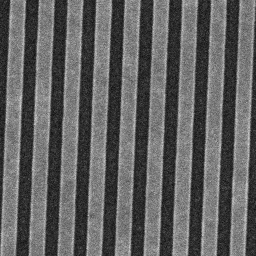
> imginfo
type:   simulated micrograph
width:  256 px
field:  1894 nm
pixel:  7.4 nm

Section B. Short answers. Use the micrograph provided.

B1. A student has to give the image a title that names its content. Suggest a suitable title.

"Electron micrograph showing parallel lines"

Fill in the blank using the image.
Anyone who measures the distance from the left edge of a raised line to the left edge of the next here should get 212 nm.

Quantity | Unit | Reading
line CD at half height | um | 0.111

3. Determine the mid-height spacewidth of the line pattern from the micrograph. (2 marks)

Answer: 13.1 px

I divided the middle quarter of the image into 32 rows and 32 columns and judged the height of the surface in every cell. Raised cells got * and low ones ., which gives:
****....***....***....***....***
****....***....***....****...***
****...****....***....****...***
****...****....***....***....***
****...****....***....***....***
****...****...****....***....***
****...****...****....***....***
****...****...****....***....***
****...****...****....***....***
****...****...****....***....***
****...****...****....***....***
****...****...****...****....***
****...****...****...****....***
***....****...****...****....***
***....****...****...****....***
***....****...****...****....***
***....****...****...****...****
***....****...****...****...****
***....***....****...****...****
***....***....****...****...****
***....***....****...****...****
***....***....***....****...****
***....***....****...****...****
***....***....****...****...****
***....***....***....***....****
***....***....***....****...****
***....***....***....****...****
***....***....***....***....****
***....***....***....***....****
***...****....***....***....***.
***...****...****....***....***.
***...****...****....***....***.